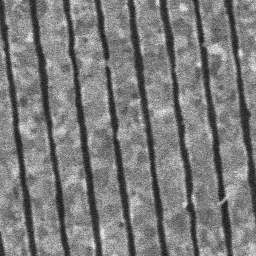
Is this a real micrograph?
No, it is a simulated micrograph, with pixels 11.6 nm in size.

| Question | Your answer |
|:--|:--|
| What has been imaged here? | parallel lines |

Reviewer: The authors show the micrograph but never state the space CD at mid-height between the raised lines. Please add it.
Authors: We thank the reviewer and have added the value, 90.6 nm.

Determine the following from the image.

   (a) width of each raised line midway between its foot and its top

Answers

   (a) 282 nanometres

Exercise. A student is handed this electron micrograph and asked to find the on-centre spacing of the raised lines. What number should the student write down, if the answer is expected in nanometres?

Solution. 376